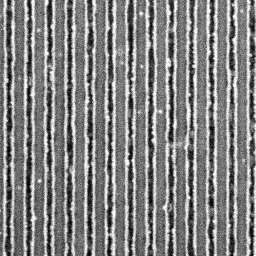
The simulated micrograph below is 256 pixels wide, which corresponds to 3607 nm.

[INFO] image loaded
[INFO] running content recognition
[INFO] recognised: parallel lines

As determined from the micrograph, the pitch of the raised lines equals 0.286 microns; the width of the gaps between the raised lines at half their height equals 160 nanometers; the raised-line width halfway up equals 120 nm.